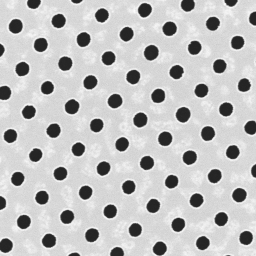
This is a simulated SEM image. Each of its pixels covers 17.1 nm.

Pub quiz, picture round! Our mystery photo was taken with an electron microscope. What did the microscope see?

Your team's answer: a regular array of holes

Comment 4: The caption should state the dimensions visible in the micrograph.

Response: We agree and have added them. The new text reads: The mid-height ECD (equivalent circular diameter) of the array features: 14.3 pixels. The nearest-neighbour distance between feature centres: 515 nm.